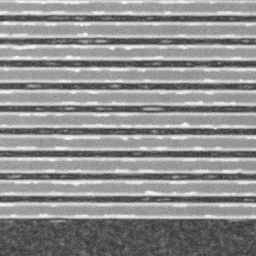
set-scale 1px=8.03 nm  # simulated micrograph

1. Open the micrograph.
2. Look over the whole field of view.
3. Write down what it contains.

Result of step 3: parallel lines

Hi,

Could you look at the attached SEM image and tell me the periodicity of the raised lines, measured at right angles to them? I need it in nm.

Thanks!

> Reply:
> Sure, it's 181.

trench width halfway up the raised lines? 68.2 nanometres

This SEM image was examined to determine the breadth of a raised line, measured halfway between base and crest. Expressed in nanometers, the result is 115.